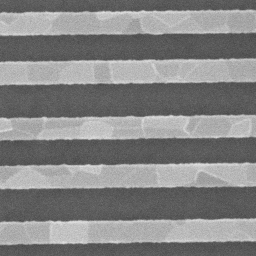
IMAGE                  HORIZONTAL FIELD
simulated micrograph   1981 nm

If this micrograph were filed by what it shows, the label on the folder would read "lines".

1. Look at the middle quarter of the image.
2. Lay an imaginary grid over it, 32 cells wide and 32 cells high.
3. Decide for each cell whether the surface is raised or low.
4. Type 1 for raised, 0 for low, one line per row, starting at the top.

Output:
11111111111111111111111111111111
11111111111111111111111111111111
11111111111111111111111111111111
11111111111111111111111111111111
11111111111111110000100000000000
00000000000000000000000000000000
00000000000000000000000000000000
00000000000000000000000000000000
00000000000000000000000000000000
00000000000000000000000000000000
00000000000000000000000000000000
00000000000000000000000000000000
00000000000000000000000000000000
00000111111111111111111111111111
11111111111111111111111111111111
11111111111111111111111111111111
11111111111111111111111111111111
11111111111111111111111111111111
11111111111111111100000000000000
00000000000000000000000000000000
00000000000000000000000000000000
00000000000000000000000000000000
00000000000000000000000000000000
00000000000000000000000000000000
00000000000000000000000000000000
11111111111111111111111111111111
11111111111111111111111111111111
11111111111111111111111111111111
11111111111111111111111111111111
11111111111111111111111111111111
11111111111111111111111100110000
00000000000000000000000000000000